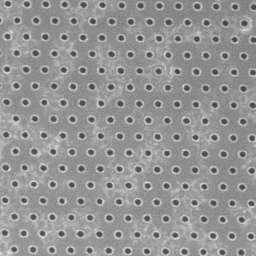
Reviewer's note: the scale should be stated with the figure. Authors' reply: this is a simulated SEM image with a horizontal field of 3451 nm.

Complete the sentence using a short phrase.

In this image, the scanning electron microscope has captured a regular array of holes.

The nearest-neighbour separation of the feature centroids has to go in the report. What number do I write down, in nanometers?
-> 248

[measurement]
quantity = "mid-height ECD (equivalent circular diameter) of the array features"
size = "90 nanometres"